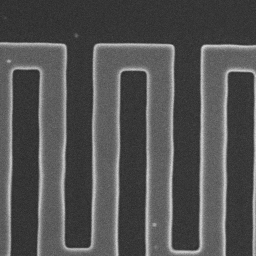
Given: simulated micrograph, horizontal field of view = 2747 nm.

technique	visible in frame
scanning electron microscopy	groups of lines, slits or small figures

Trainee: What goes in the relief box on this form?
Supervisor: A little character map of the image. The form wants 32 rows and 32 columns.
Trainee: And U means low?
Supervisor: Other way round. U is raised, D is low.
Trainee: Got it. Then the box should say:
DDDDDDDDDDDDDDDDDDDDDDDDDDDDDDDD
DDDDDDDDDDDDDDDDDDDDDDDDDDDDDDDD
DDDDDDDDDDDDDDDDDDDDDDDDDDDDDDDD
DDDDDDDDDDDDDDDDDDDDDDDDDDDDDDDD
DDDDDDDDDDDDDDDDDDDDDDDDDDDDDDDD
UUUUUUUUDDDDUUUUUUDDDDDDDDDDDDDD
UUUUUUUUDDDDUUUUUUUUUUDDDUUUUUUU
UUUUUUUUDDDDUUUUUUUUUUDDDUUUUUUU
UUUUUUUUDDDDUUUUUUUUUUDDDUUUUUUU
UUDDDUUUDDDDUUUDDDUUUUDDDUUUDDDD
UDDDDUUUDDDDUUUDDDUUUUDDDUUUDDDD
UUDDDUUUDDDDUUUDDDUUUUDDDUUUDDDD
UUDDDUUUDDDDUUUDDDUUUUDDDUUUDDDD
UDDDDUUUDDDDUUUDDDUUUUDDDUUUDDDD
UDDDDUUUDDDDUUUDDDUUUUDDDUUUDDDD
UDDDDUUUDDDDUUUDDDUUUUDDDUUUDDDD
UDDDDUUUDDDDUUUDDDUUUUDDDUUUDDDD
UDDDDUUUDDDDUUUDDDUUUUDDDUUUDDDD
UDDDDUUUDDDDUUUDDDUUUUDDDUUUDDDD
UDDDDUUUDDDDUUUDDDUUUUDDDUUUDDDD
UDDDDUUUDDDDUUUDDDUUUUDDDUUUDDDD
UDDDDUUUDDDDUUUDDDUUUDDDDUUUDDDD
UDDDDUUUDDDDUUUDDDUUUDDDDUUUDDDD
UDDDDUUUDDDDUUUDDDUUUDDDDUUUDDDD
UDDDDUUUDDDDUUUDDDUUUDDDDUUUDDDD
UDDDDUUUDDDDUUUDDDUUUDDDDUUUDDDD
UDDDDUUUDDDDUUUDDDUUUDDDDUUUDDDD
UDDDDUUUDDDDUUUDDDUUUDDDDUUUDDDD
UDDDDUUUDDDDUUUDDDUUUDDDDUUUDDDD
UDDDDUUUDDDUUUUDDDUUUDDDDUUUDDDD
UDDDDUUUDDDUUUUDDDUUUDDDDUUUDDDD
UDDDDUUUUUUUUUUDDDUUUUUUUUUUDDDD